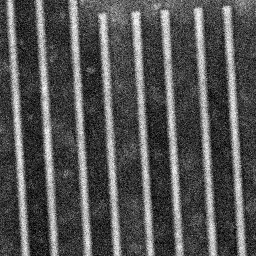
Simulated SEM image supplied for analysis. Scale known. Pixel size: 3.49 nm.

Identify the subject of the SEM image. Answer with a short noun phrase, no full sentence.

parallel lines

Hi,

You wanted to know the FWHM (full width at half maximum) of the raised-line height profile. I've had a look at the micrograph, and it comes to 20.9 nm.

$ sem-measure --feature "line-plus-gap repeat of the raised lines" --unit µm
0.108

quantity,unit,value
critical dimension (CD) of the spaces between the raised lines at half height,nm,80.6